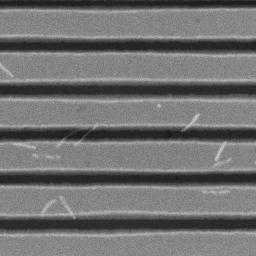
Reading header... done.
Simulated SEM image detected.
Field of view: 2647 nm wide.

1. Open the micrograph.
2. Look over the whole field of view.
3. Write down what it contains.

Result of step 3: lines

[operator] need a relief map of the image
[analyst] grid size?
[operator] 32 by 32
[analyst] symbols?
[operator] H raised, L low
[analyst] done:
LLLLLLLLLLLLLLLLLLLLLLLLLLLLLLLL
HHHHHHHHHHHHHHHHHHHHHHHHHHHHHHHH
HHHHHHHHHHHHHHHHHHHHHHHHHHHHHHHH
HHHHHHHHHHHHHHHHHHHHHHHHHHHHHHHH
HHHHHHHHHHHHHHHHHHHHHHHHHHHHHHHH
LLLLLLLLLLLLLLLLLLLLLLLLLLLLLLLL
LLLLLLLLLLLLLLLLLLHLLLLLLLLLLLLL
HHHHHHHHHHHHHHHHHHHHHHHHHHHHHHHH
HHHHHHHHHHHHHHHHHHHHHHHHHHHHHHHH
HHHHHHHHHHHHHHHHHHHHHHHHHHHHHHHH
LLLLLLLLLLLLLLLLLLLLLLLLLLLLLLLL
LLLLLLLLLLLLLLLLLLLLLLLLLLLLLLLL
HHHHHHHHHHHHHHHHHHHHHHHHHHHHHHHH
HHHHHHHHHHHHHHHHHHHHHHHHHHHHHHHH
HHHHHHHHHHHHHHHHHHHHHHHHHHHHHHHH
HHHHHHHHHHHHHHHHHHHHHHHHHHHHHHHH
LLLLLLLLLLLLLLLLLLLLLLLLLLLLLLLL
LLLLLLLLLLLLLLLLLLLLLLLLLLLLLLLL
HHHHHHHHHHHHHHHHHHHHHHHHHHHHHHHH
HHHHHHHHHHHHHHHHHHHHHHHHHHHHHHHH
HHHHHHHHHHHHHHHHHHHHHHHHHHHHHHHH
LLLLLLLLLLLLLLLLLLHHHHHHLLLLLLLL
LLLLLLLLLLLLLLLLLLLLLLLLLLLLLLLL
HHHHHHHHHHHHHHHHHHHHHHHHHHHHHHHH
HHHHHHHHHHHHHHHHHHHHHHHHHHHHHHHH
HHHHHHHHHHHHHHHHHHHHHHHHHHHHHHHH
HHHHHHHHHHHHHHHHHHHHHHHHHHHHHHHH
LLLLLLLLLLLLLLLLLLLLLLLLLLLLLLLL
LLLLLLLLLLLLLLLLLLLLLLLLLLLLLLLL
HHHHHHHHHHHHHHHHHHHHHHHHHHHHHHHH
HHHHHHHHHHHHHHHHHHHHHHHHHHHHHHHH
HHHHHHHHHHHHHHHHHHHHHHHHHHHHHHHH